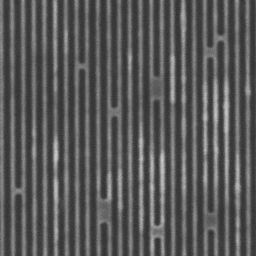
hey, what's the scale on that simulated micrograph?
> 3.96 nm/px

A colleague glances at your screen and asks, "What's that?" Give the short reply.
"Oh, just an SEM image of parallel lines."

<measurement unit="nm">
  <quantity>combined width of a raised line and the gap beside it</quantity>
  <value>42.4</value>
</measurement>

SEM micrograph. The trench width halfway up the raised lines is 8.01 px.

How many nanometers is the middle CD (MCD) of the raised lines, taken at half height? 10.4